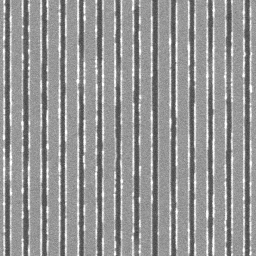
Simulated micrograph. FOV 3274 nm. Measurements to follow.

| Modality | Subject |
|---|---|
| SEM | parallel lines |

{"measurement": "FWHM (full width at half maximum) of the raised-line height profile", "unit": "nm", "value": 94.3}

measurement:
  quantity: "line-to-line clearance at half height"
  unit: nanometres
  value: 142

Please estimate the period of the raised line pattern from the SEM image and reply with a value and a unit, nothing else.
236 nm